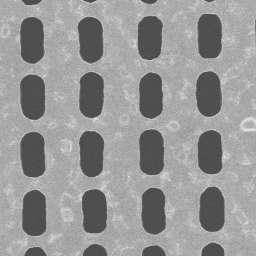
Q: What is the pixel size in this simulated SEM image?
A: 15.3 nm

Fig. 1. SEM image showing a regular array of holes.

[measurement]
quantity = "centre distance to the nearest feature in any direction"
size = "877 nm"